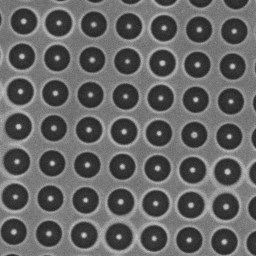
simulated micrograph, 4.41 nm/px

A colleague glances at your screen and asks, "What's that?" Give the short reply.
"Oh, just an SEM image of an array of small figures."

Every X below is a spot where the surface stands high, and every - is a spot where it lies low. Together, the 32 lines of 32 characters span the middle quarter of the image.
-XXX------XXX------XX-------XX--
XXXXX----XXXX------XX-------XX--
XXXXXXXXXXXXXXX--XXXXX-----XXXX-
XXXXXXXXXXXXXXXXXXXXXXXX-XXXXXXX
XXXXXX-XXXXXXXXXXXXXXXXXXXXXXXXX
-XXX-----XXXX----XXXXX----XXXXXX
-XXX------XXX-----XXX------XXXX-
-XX-------XX-------XX-------XX--
-XX-------XX-------XX-------XX--
XXXX-----XXX-------XX------XXX--
XXXXX----XXXX-----XXX------XXX--
XXXXXXXXXXXXXXX--XXXXX----XXXXX-
XXXXXXXXXXXXXXXXXXXXXXXXXXXXXXXX
XXXXX---XXXXXX--XXXXXXXXXXXXXXXX
XXXX-----XXX------XXXX----XXXXXX
-XX-------XX------XXX------XXX--
-XX-------X--------X-------XXX--
-XX-------X--------X-------XX---
XXX------XXX------XX-------XX---
XXXXX---XXXXX-----XXX-----XXXX--
XXXXXXXXXXXXXXXXXXXXXX---XXXXXX-
XXXXXXXXXXXXXXXXXXXXXXXXXXXXXXXX
XXXX----XXXXX---XXXXXXXXXXXXXXXX
XXX------XXX-----XXXX-----XXXX--
XX-------XX-------XX------XXX---
XX-------XX-------XX-------XX---
XXX------XX-------XX-------XX---
XXX-----XXXX-----XXX-------XX---
XXXXX--XXXXXX---XXXXX-----XXX---
XXXXXXXXXXXXXXXXXXXXXX--XXXXXX--
XXXXXXXXXXXXXXXXXXXXXXXXXXXXXXXX
XXX-----XXXXX---XXXXXX--XXXXXXXX